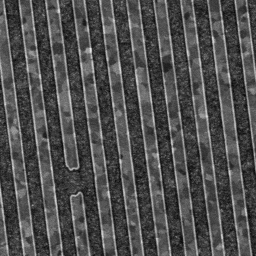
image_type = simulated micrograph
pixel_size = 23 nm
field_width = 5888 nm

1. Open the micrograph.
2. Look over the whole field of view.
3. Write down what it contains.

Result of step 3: parallel lines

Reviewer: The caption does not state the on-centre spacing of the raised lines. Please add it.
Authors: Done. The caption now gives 616 nanometers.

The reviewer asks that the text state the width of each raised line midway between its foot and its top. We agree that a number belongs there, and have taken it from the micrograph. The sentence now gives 0.268 microns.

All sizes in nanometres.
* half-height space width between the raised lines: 351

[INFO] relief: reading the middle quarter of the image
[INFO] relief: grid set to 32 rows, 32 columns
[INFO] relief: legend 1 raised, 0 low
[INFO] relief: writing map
00001110000111000011100001100001
10001110000111000011100001110001
10001110000111000011100001110000
10000111000111000011100001110000
10000111000011100011100001110000
10000111000011100011100001110000
10000111000011100001110001110000
10000111000011100001110001110000
10000111000011100001110000110000
11000111000011100001110000110000
11000111000011100001110000111000
11000011100011100001110000111000
11000011100001110001110000111000
11000011100001110001110000111001
11000011100001110000111000111000
11000011100001110000111000111000
11000011100001110000111000011111
11100011100001110000111000011100
11100011100001110000111000011100
11100001110000110000111000011100
11100001110000111000111000011100
11100001110000110000111000011100
11100001110000111000011100011100
11100001110000111000011100011100
11100001110000111000011100001100
01110001110000111000011100001100
00000000110000111000011100001110
00000000111000111000011100001110
00000000111000111100011100001110
00000000111000011100011100001110
00000000111000011100001110001110
00000000111000011100001110001110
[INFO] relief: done